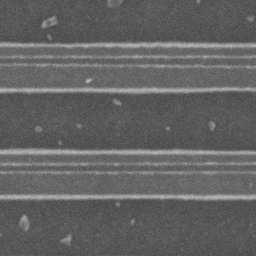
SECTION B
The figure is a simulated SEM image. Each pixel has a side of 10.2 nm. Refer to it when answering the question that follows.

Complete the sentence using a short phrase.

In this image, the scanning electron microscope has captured lines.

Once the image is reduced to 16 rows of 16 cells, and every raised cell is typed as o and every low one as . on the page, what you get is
................
................
................
oooooooooooooooo
oooooooooooooooo
oooooooooooooooo
................
................
................
................
oooooooooooooooo
oooooooooooooooo
................
................
................
................